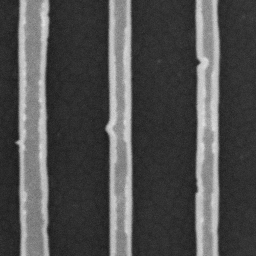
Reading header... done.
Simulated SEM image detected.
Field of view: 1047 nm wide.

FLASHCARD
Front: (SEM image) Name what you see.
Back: one or a few lines or trenches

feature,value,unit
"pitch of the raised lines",357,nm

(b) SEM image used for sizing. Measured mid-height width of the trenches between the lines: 276 nm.